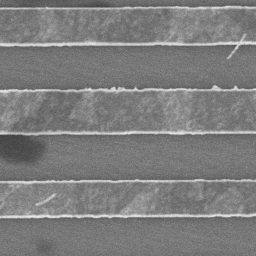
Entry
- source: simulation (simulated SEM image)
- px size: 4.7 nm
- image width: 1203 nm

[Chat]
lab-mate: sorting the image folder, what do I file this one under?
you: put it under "lines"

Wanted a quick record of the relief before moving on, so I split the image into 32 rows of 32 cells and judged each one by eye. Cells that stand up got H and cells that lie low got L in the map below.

LLLLLLLLLLLLLLLLLLLLLLLLLLLLLLLL
HHHHHHHHHHHHHHHHHHHHHHHHHHHHHHHH
HHHHHHHHHHHHHHHHHHHHHHHHHHHHHHHH
HHHHHHHHHHHHHHHHHHHHHHHHHHHHHHHH
HHHHHHHHHHHHHHHHHHHHHHHHHHHHHHHH
HHHHHHHHHHHHHHHHHHHHHHHHHHHHLHLL
LLLLLLLLLLLLLLLLLLLLLLLLLLLLLLLL
LLLLLLLLLLLLLLLLLLLLLLLLLLLLLLLL
LLLLLLLLLLLLLLLLLLLLLLLLLLLLLLLL
LLLLLLLLLLLLLLLLLLLLLLLLLLLLLLLL
LLLLLLLLLLLLLLLLLLLLLLLLLLLLLLLL
HHHHHHHHHHHHHHHHHHHHHHHHHHHHHHHH
HHHHHHHHHHHHHHHHHHHHHHHHHHHHHHHH
HHHHHHHHHHHHHHHHHHHHHHHHHHHHHHHH
HHHHHHHHHHHHHHHHHHHHHHHHHHHHHHHH
HHHHHHHHHHHHHHHHHHHHHHHHHHHHHHHH
HHHHHHHHHHHHHHHHHHHHHHHHHHHHHHHH
LLLLLLLLLLLLLLLLLLLLLLLLLLLLLLLL
LLLLLLLLLLLLLLLLLLLLLLLLLLLLLLLL
LLLLLLLLLLLLLLLLLLLLLLLLLLLLLLLL
LLLLLLLLLLLLLLLLLLLLLLLLLLLLLLLL
LLLLLLLLLLLLLLLLLLLLLLLLLLLLLLLL
LLLLLLLLLLLLLLLLLLLLLLLLHLLLLLLL
HHHHHHHHHHHHHHHHHHHHHHHHHHHHHHHH
HHHHHHHHHHHHHHHHHHHHHHHHHHHHHHHH
HHHHHHHHHHHHHHHHHHHHHHHHHHHHHHHH
HHHHHHHHHHHHHHHHHHHHHHHHHHHHHHHH
LLLLLLLLLLLLLLLLLLLLLLLLLLLLLLLL
LLLLLLLLLLLLLLLLLLLLLLLLLLLLLLLL
LLLLLLLLLLLLLLLLLLLLLLLLLLLLLLLL
LLLLLLLLLLLLLLLLLLLLLLLLLLLLLLLL
LLLLLLLLLLLLLLLLLLLLLLLLLLLLLLLL